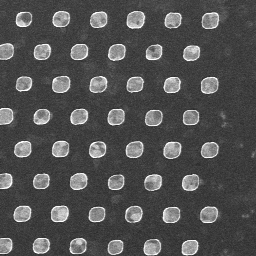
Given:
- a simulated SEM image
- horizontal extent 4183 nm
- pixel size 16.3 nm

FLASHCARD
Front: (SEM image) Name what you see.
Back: a regular array of raised bodies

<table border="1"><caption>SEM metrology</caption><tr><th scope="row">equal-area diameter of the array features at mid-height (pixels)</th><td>16.7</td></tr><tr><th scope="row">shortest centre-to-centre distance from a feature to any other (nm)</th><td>604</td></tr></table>